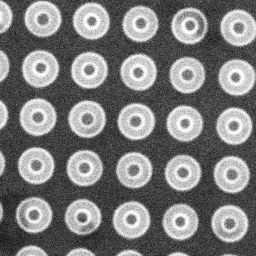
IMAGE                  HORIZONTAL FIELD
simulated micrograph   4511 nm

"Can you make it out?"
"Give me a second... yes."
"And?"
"an array of small figures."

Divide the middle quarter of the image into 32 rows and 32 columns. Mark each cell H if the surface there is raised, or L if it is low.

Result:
HHLLLHHHLLHHHHHLLLHLLLHHHHHHLLLL
HHLLLHHHLLLHHHLLLHHHLLLHHHHLLLHH
HHLLLHHHLLHHHHHLLHHHLLLHHHHLLHHH
HHHLLLLLLLHHHHHLLHHHLLLHHHHLLHHH
HHHLLLLLLHHHHHHLLLLLLLHHHHHLLLLL
HHHHHLLLHHHHHHHHLLLLLHHHHHHHLLLL
HHHHHHHHHHHHHHHHHHHHHHHHHHHHHLLL
HHHHHHHHHHHHHHHHHHHHHHHHHHHHHHHH
HHHHHHHHHHHHHHHHHHHHHHHHHHHHHHHH
HHHHHHLHHHHHHHHHHHHHHHHHHHHHHHHH
HHHLLLLLLHHHHHHHHLLHHHHHHHHHHHHH
HHLLLLLLLHHHHHHLLLLLLHHHHHHHLLLL
HHLLHHHLLLHHHHLLLLLLLLHHHHHLLLLL
HHLLHHHHLLHHHHLLHHHHLLHHHHLLLHHL
HHLLHHHHLLHHHHLLHHHHLLHHHHLLLHHH
HHLLLHHLLLHHHHLLLHHLLLHHHHLLLHHH
HHHLLLLLLHHHHHLLLLLLLLHHHHLLLLHL
HHHHLLLLHHHHHHHLLLLLLHHHHHHLLLLL
HHHHHHHHHHHHHHHHHLHHHHHHHHHHHLLL
HHHHHHHHHHHHHHHHHHHHHHHHHHHHHHHH
HHHHHHHHHHHHHHHHHHHHHHHHHHHHHHHH
HHHHHHHHHHHHHHHHHHHHHHHHHHHHHHHH
HHHLLLLHHHHHHHHHHLHHHHHHHHHHHHHH
HHLLLLLLHHHHHHHLLLLLHHHHHHHHLLLH
HHLLHHLLLHHHHHLLLLLLLHHHHHHLLLLL
HLLHHHHLLHHHHHLLHHHLLHHHHHLLLHLL
HLLHHHHLLHHHHLLLHHHLLLHHHHLLHHHL
HLLLHHLLLHHHHHLLHHHLLHHHHHLLHHHL
HHLLLLLLHHHHHHLLLHLLLHHHHHLLHHHL
HHHLLLLHHHHHHHHLLLLLHHHHHHLLLLLL
HHHHHHHHHHHHHHHHHLLHHHHHHHHLLLLL
HHHHHHHHHHHHHHHHHHHHHHHHHHHHHHHH